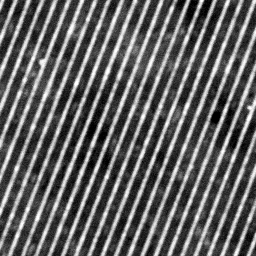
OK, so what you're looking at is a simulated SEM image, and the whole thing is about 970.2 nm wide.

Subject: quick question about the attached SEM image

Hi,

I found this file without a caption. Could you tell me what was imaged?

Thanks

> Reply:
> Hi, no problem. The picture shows parallel lines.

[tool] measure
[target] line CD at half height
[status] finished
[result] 8.4 nanometres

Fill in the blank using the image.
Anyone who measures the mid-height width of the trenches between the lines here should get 40.2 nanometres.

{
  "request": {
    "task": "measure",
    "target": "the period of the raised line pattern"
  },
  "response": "0.0469 um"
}